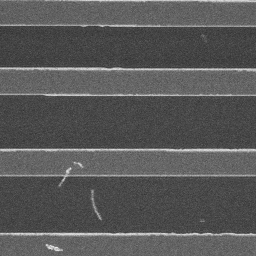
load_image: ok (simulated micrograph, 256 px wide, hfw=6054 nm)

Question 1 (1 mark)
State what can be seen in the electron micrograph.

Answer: lines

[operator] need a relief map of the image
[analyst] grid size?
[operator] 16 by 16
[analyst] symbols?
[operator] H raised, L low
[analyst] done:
HHHHHHHHHHHHHHHH
HHHHHHHHHHHHHHHH
LLLLLLLLLLLLLLLL
LLLLLLLLLLLLLLLL
HHHHHHHHHHHHHHHH
HHHHHHHHHHHHHHHH
LLLLLLLLLLLLLLLL
LLLLLLLLLLLLLLLL
LLLLLLLLLLLLLLLL
HHHHHHHHHHHHHHHH
HHHHHHHHHHHHHHHH
LLLLLLLLLLLLLLLL
LLLLLLLLLLLLLLLL
LLLLLLLLLLLLLLLL
LLLLLLLLLLLLLLLL
HHHHHHHHHHHHHHHH